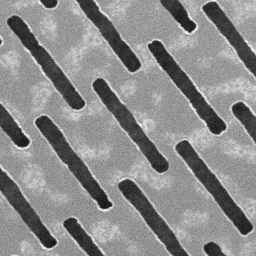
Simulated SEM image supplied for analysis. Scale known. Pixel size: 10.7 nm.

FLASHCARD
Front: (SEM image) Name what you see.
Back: holes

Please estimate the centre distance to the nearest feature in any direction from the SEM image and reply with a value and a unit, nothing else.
728 nm